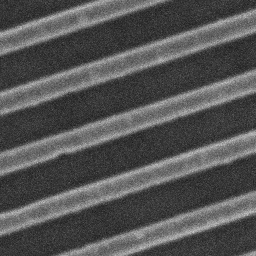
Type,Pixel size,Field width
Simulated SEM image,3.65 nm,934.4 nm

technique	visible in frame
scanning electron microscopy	parallel lines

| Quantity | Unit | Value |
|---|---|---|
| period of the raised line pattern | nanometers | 209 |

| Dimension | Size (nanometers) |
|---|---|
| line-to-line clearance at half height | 138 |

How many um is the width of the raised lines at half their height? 0.0702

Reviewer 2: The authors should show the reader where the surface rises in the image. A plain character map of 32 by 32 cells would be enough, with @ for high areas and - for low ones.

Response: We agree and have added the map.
-----------@@@@@@@@-------------
--------@@@@@@@@---------------@
-----@@@@@@@@---------------@@@@
--@@@@@@@@---------------@@@@@@@
@@@@@@@---------------@@@@@@@@--
@@@@---------------@@@@@@@@-----
@---------------@@@@@@@@--------
-------------@@@@@@@@-----------
----------@@@@@@@@--------------
-------@@@@@@@@---------------@@
----@@@@@@@@---------------@@@@@
-@@@@@@@----------------@@@@@@@-
@@@@@@---------------@@@@@@@----
@@@---------------@@@@@@@-------
---------------@@@@@@@----------
------------@@@@@@@-------------
---------@@@@@@@----------------
------@@@@@@@----------------@@@
---@@@@@@@----------------@@@@@@
@@@@@@@---------------@@@@@@@@--
@@@@----------------@@@@@@@-----
@----------------@@@@@@@--------
--------------@@@@@@@-----------
----------@@@@@@@@--------------
-------@@@@@@@@----------------@
----@@@@@@@@---------------@@@@@
--@@@@@@----------------@@@@@@@@
@@@@@----------------@@@@@@@@---
@@@---------------@@@@@@@@------
---------------@@@@@@@@---------
------------@@@@@@@@------------
---------@@@@@@@----------------